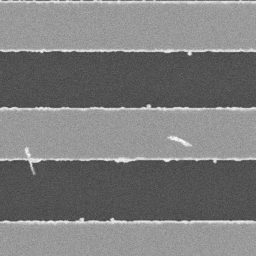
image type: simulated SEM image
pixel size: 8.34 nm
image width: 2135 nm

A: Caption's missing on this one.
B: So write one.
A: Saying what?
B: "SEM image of lines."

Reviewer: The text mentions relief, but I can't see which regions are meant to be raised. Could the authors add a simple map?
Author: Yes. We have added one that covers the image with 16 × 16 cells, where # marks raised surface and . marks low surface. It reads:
################
################
################
................
................
................
................
################
################
################
................
................
................
................
################
################